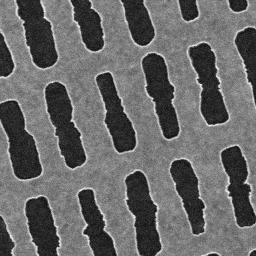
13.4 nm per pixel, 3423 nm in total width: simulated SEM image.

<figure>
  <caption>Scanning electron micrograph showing holes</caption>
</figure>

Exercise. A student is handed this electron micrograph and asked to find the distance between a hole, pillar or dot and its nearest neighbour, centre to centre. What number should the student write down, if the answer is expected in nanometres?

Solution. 669